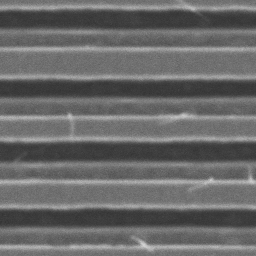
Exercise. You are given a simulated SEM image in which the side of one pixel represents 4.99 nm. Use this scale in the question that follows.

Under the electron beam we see lines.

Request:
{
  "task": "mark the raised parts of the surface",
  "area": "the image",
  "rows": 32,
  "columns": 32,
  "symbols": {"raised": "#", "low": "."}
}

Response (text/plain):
################################
................................
................................
................................
################################
################################
################################
################################
################################
################################
................................
................................
################################
################################
################################
################################
################################
#######.#........#####.....##...
................................
................................
..######################.#######
################################
################################
################################
################################
################################
................................
................................
................................
################################
################################
################################